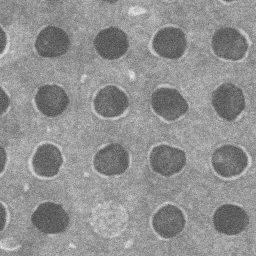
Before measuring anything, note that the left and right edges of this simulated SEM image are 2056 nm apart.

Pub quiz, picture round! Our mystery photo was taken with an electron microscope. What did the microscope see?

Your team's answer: a regular array of holes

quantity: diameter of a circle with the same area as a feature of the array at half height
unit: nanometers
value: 282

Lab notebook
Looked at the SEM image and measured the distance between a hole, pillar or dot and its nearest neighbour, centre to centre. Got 466 nm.